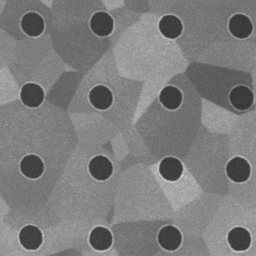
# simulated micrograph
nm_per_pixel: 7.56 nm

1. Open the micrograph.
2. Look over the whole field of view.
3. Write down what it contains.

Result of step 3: a regular array of holes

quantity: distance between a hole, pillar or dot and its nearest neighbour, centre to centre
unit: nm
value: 521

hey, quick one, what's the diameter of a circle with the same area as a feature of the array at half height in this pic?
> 0.191 microns